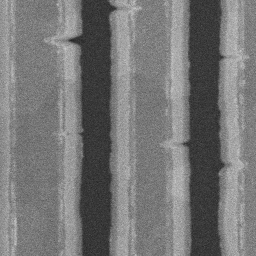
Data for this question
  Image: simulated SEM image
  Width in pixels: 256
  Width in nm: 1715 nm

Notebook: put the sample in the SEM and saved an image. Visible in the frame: one or a few lines or trenches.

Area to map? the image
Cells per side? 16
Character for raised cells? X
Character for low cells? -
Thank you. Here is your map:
XXXX----XXX----X
XXXX----XXX----X
XXXX----XXX---XX
XXXX----XXX---XX
XXXX----XXX---XX
XXXX----XXX---XX
XXXX----XXX---XX
XXXX----XXX----X
XXXX----XXX----X
XXXX----XXX----X
XXXX----XXX----X
XXXX----XXX----X
XXXX----XXX---XX
XXXX----XXX---XX
XXXX----XXX---XX
XXXX----XXX---XX